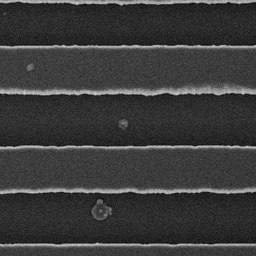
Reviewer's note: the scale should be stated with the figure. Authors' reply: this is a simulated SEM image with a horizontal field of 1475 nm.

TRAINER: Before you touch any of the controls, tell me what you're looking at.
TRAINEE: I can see lines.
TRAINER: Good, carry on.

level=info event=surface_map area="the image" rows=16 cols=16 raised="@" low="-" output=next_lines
----------------
----------------
----------------
@@@@@@@@@@@@@@@@
@@@@@@@@@@@@@@@@
@@@@@@@@@@@@@@@@
----------------
----------------
----------------
@@@@@@@@@@@@@@@@
@@@@@@@@@@@@@@@@
@@@@@@@@@@@@@@@@
----------------
----------------
----------------
@@@@@@@@@@@@@@@@